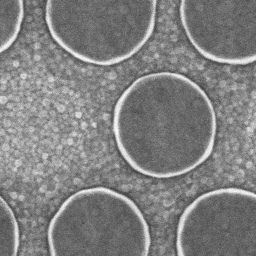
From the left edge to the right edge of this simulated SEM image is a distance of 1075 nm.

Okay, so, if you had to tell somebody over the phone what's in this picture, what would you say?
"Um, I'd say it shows raised bodies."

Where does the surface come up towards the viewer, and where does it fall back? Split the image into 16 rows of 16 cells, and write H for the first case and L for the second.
HLLHHHHHHHLHHHHH
HLLHHHHHHHLLHHHH
HLLLHHHHHLLLHHHH
LLLLLHHHLLLLLHHH
LLLLLLLLLLLLLLLL
LLLLLLLLHHHHLLLL
LLLLLLLHHHHHHLLL
LLLLLLLHHHHHHLLL
LLLLLLLHHHHHHLLL
LLLLLLLLHHHHHLLL
LLLLLLLLLHHHLLLL
LLLLLLLLLLLLLLLL
LLLLHHHHLLLLHHHH
HLLHHHHHHLLHHHHH
HLLHHHHHHLLHHHHH
HLLHHHHHHLLHHHHH